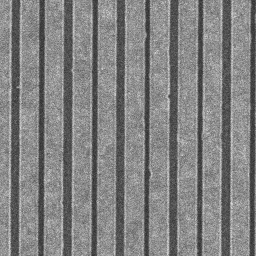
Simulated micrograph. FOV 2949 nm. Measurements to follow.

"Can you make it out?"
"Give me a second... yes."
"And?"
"parallel lines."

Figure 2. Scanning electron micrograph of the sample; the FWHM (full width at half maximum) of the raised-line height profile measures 210 nm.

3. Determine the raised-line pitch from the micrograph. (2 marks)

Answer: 304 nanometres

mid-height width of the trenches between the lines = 104 nanometers